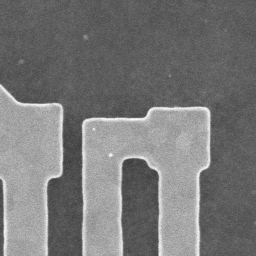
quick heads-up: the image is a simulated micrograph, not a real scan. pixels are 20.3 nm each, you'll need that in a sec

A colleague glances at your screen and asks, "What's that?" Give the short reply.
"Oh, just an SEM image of wiring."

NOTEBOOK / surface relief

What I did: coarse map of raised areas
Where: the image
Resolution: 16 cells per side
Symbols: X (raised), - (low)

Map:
----------------
----------------
----------------
----------------
----------------
----------------
XX--------------
XXXX--XXXXXXX---
XXXX-XXXXXXXX---
XXXX-XXXXXXXX---
XXXX-XXX--XXX---
XXX--XXX--XX----
XXX--XXX--XX----
XXX--XXX--XX----
XXX--XXX--XX----
XXX--XXX--XX----